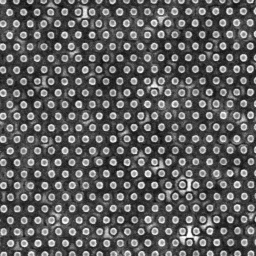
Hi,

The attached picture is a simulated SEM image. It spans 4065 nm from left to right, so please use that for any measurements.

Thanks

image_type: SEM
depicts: a regular array of raised bodies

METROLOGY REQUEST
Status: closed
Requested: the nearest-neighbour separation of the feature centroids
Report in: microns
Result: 0.209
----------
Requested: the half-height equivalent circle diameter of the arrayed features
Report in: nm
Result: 101